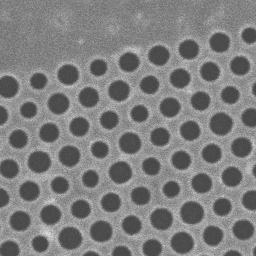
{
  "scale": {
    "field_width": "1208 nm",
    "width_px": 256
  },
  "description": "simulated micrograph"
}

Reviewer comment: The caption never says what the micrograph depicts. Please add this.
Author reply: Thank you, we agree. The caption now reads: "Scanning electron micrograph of a regular array of holes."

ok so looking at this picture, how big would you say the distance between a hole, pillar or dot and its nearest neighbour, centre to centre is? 144 nm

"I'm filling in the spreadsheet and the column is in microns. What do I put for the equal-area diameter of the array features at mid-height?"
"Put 0.097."